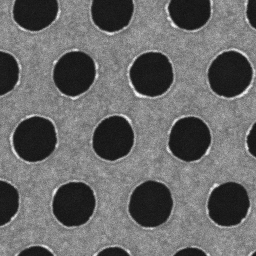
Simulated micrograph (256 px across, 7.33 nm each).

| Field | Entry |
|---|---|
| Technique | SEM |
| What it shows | a regular array of holes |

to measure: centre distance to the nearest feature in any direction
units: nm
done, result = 555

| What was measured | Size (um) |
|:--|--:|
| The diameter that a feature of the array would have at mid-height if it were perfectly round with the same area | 0.328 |